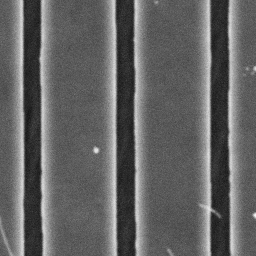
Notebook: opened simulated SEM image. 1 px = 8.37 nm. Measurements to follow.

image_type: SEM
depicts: lines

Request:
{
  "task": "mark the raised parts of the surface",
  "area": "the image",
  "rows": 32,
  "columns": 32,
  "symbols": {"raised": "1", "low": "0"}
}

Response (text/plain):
11100111111111000111111111000111
11100111111111000111111111000111
11100111111111000111111111000111
11100111111111000111111111000111
11100111111111000111111111000111
11100111111111000111111111000111
11100111111111000111111111000111
11100111111111000111111111000111
11100111111111000111111111000111
11100111111111000111111111000111
11100111111111000111111111000111
11100111111111000111111111000111
11100111111111000111111111000111
11100111111111000111111111000111
11100111111111000111111111000111
11100111111111000111111111000111
11100111111111000111111111000111
11100111111111000111111111000111
11100111111111000111111111000111
11100111111111000111111111000111
11100111111111000111111111000111
11100111111111000111111111000111
11100111111111000111111111000111
11100111111111000111111111000111
11100111111111000111111111000111
11100111111111000111111111000111
11100111111111000111111111000111
11100111111111000111111111000111
11100111111111000111111111000111
11100111111111000111111111000111
11100111111111000111111111000111
11100111111111000111111111000111